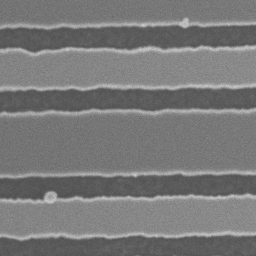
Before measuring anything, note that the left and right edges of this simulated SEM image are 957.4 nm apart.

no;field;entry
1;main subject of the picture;lines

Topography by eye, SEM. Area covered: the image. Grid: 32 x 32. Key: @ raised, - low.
@@@@@@@@@@@@@@@@@@@@@@@@@@@@@@@@
@@@@@@@@@@@@@@@@@@@@@@@@@@@@@@@@
@@@@@@@@@@@@@@@@@@@@@@@@@@@@@@@@
@---@@@--@----------------------
--------------------------------
--------------------------------
@@@@-@@@@@@@@@@@@@@@@@@@@@@@@@@@
@@@@@@@@@@@@@@@@@@@@@@@@@@@@@@@@
@@@@@@@@@@@@@@@@@@@@@@@@@@@@@@@@
@@@@@@@@@@@@@@@@@@@@@@@@@@@@@@@@
@@@@@@@@@@@@@@@@@@@@@@@@@@@@@@@@
--------------------------------
--------------------------------
--------------------------------
@@@@@@@@@@@@@@@@@@@@@@@@@@@@@@@@
@@@@@@@@@@@@@@@@@@@@@@@@@@@@@@@@
@@@@@@@@@@@@@@@@@@@@@@@@@@@@@@@@
@@@@@@@@@@@@@@@@@@@@@@@@@@@@@@@@
@@@@@@@@@@@@@@@@@@@@@@@@@@@@@@@@
@@@@@@@@@@@@@@@@@@@@@@@@@@@@@@@@
@@@@@@@@@@@@@@@@@@@@@@@@@@@@@@@@
@@@@@@@@@@@@@@@@@@@@@@@@@@@@@@@@
--------------------------------
--------------------------------
------@---------------@@@@--@@@@
@@@@@@@@@@@@@@@@@@@@@@@@@@@@@@@@
@@@@@@@@@@@@@@@@@@@@@@@@@@@@@@@@
@@@@@@@@@@@@@@@@@@@@@@@@@@@@@@@@
@@@@@@@@@@@@@@@@@@@@@@@@@@@@@@@@
@@@@@@@@@@@@@@@@--@@@@@@@@@-----
--------------------------------
--------------------------------